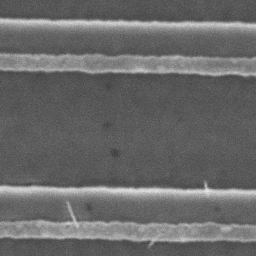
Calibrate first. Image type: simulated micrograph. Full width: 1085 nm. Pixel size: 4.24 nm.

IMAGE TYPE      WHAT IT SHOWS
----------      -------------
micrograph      lines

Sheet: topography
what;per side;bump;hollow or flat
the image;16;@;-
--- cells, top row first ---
----------------
@@@@@@@@@@@@----
@@@@@@@@@@@@@@@@
@@@@@@@@@@@@@@@@
--------@@@@@@@@
----------------
----------------
----------------
----------------
----------------
----------------
----------------
@@@@@@@@@@@@@@@@
@@@@@@@@@@@@@@@@
@@@@@@@@@@@@@@@@
----------------